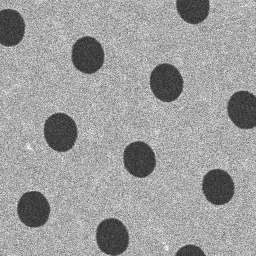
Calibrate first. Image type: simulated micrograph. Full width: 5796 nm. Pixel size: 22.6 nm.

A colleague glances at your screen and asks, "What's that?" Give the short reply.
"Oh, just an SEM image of holes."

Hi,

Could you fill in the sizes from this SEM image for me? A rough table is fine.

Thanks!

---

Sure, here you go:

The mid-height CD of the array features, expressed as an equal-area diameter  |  798 nm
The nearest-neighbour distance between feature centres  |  1850 nm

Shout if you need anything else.